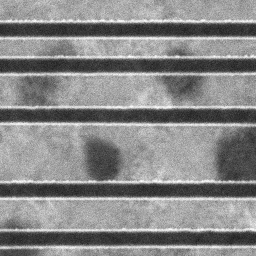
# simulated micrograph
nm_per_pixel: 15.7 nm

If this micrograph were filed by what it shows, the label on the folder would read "lines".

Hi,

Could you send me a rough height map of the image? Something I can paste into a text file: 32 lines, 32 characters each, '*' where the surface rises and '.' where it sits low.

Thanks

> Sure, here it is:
................................
................................
................................
********************************
********************************
................................
................................
********************************
********************************
................................
................................
................................
................................
********************************
********************************
.........*...*******************
................................
................................
................................
................................
................................
................................
................................
********************************
********************************
................................
................................
................................
................................
********************************
********************************
................................